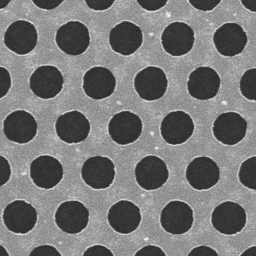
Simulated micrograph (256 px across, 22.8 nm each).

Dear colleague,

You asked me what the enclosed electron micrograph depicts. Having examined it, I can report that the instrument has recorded a regular array of holes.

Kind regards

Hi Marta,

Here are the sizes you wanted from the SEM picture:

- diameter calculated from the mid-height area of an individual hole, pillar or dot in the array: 0.773 micrometres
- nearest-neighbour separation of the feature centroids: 1170 nanometres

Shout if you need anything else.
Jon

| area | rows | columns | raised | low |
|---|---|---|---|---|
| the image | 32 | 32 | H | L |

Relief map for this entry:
LHHHLLLLHHHLLLHHHLLLLHHHLLLHHHLL
HHHHHHHHHHHHHHHHHHHHHHHHHHHHHHHH
HHHHHHHHHHHHHHHHHHHHHHHHHHHHHHHH
HLLLHHHLLLLHHHLLLHHHHLLLHHHLLLHH
HLLLLHHLLLLHHHLLLLHHLLLLHHHLLLLH
HLLLLHHLLLLHHHLLLLHHLLLLHHHLLLLH
HHLLHHHHLLHHHHLLLHHHHLLLHHHLLLHH
HHHHHHHHHHHHHHHHHHHHHHHHHHHHHHHH
HHHHHLLHHHHHLHHHHHLLHHHHHLHHHHHH
LHHHLLLLHHLLLLHHHLLLLHHHLLLHHHLL
LHHHLLLLHHLLLLHHHLLLLHHLLLLHHHLL
LHHHLLLLHHHLLLHHHLLLLHHHLLLHHHLL
HHHHHHHHHHHHHHHHHHLHHHHHHHHHHHHL
HHHHHHHHHHHHHHHHHHHHHHHHHHHHHHHH
HLLLHHHHLLLHHHLLLHHHHLLLHHHLLLHH
LLLLLHHLLLLHHHLLLLHHLLLLHHHLLLLH
LLLLLHHLLLLHHHLLLLHHLLLLHHHLLLLH
HLLLHHHHLLHHHHLLLHHHHLLHHHHLLLHH
HHHHHHHHHHHHHHHHHHHHHHHHHHHHHHHH
HHHHHLHHHHHHHHHHHHLHHHHHHHHHHHHH
LHHHLLLLHHLLLLHHHLLLLHHHLLLHHHLL
LHHHLLLLHHLLLLHHHLLLLHHLLLLHHHLL
LHHHLLLLHHLLLLHHHLLLLHHLLLLHHHLL
HHHHHLHHHHHHLHHHHHLLHHHHLLHHHHHL
HHHHHHHHHHHHHHHHHHHHHHHHHHHHHHHH
HLLLHHHHLLHHHHLLLHHHHLLHHHHHLLHH
LLLLLHHLLLLHHLLLLHHHLLLLHHHLLLLH
LLLLLHHLLLLHHLLLLLHHLLLLHHLLLLLH
HLLLHHHLLLLHHHLLLHHHLLLLHHHLLLHH
HHHHHHHHHHHHHHHHHHHHHHHHHHHHHHHH
HHHHHHHHHHHHHHHHHHHHHHHHHHHHHHHH
LHHHLLLHHHHLLLHHHLLLHHHHLLLHHHLL